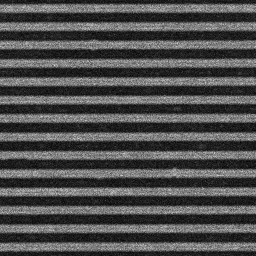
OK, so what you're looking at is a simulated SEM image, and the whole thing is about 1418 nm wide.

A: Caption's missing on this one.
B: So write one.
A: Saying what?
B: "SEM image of parallel lines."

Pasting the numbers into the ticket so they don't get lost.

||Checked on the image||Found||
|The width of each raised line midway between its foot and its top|0.0346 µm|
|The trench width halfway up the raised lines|64.4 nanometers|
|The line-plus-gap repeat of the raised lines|102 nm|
